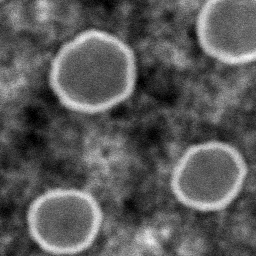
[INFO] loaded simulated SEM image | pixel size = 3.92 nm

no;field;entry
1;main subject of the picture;raised bodies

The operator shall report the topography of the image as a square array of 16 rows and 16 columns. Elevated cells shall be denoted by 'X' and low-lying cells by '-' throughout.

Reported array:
-------------XXX
------------XXXX
-----XX------XXX
----XXXX------XX
---XXXXX--------
----XXXX--------
----XXX---------
----------------
----------------
------------XXX-
-----------XXXX-
-----------XXXX-
--XXXX------XX--
--XXXX----------
--XXXX----------
---XX-----------